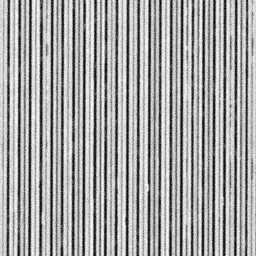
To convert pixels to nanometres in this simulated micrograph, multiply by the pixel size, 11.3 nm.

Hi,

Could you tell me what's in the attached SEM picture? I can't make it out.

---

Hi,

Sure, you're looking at parallel lines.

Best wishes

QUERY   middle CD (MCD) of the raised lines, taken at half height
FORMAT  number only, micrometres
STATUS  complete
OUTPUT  0.0255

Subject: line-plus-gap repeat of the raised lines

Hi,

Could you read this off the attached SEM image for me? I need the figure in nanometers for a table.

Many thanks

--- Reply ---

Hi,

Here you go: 61.4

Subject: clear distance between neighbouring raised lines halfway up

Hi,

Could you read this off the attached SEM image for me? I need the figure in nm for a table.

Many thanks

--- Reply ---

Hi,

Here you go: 25.5